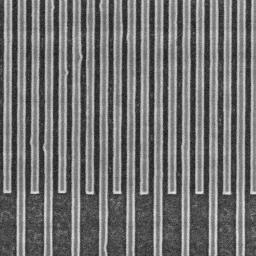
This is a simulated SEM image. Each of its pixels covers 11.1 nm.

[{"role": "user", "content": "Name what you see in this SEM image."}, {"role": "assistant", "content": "parallel lines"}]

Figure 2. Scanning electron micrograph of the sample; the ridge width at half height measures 72.3 nm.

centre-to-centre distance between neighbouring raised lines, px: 13.7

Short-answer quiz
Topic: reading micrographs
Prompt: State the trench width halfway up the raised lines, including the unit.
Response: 0.0834 microns